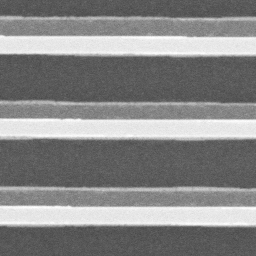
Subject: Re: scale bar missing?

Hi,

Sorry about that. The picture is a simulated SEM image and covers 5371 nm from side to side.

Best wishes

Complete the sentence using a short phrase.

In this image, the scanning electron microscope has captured lines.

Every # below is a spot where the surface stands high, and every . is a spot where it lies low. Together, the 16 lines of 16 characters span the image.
................
################
################
................
................
................
#######.........
################
################
................
................
................
################
################
................
................